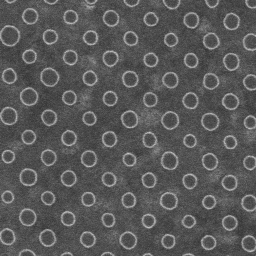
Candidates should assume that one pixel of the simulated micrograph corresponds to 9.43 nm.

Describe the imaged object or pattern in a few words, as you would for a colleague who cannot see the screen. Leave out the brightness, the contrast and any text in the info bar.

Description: a regular array of raised bodies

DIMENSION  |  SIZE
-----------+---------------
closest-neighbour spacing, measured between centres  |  265 nm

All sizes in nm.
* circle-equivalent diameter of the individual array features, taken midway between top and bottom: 136